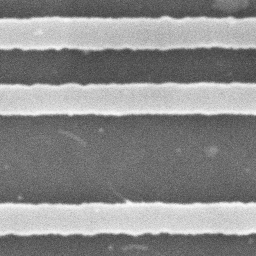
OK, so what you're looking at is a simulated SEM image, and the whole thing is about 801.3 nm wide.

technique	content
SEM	lines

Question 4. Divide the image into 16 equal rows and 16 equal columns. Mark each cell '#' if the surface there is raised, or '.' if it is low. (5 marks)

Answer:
................
################
################
................
................
################
################
................
................
................
................
................
................
################
################
................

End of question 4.